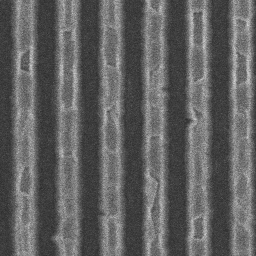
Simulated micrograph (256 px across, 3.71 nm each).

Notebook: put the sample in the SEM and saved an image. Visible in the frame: parallel lines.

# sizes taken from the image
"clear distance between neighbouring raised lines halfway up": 81.2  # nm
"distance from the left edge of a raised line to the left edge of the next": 0.161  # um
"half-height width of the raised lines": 0.0784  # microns